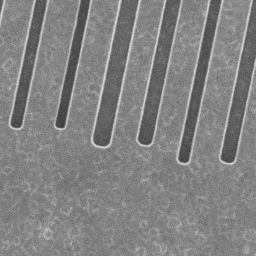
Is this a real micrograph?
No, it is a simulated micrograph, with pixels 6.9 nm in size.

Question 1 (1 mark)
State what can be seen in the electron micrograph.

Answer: parallel lines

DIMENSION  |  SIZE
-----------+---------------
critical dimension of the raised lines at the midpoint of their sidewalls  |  204 nanometers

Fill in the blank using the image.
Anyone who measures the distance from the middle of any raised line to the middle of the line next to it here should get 0.292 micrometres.